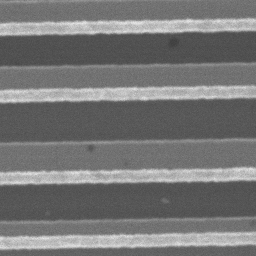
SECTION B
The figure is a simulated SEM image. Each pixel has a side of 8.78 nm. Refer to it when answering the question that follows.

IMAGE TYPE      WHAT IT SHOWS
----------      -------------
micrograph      lines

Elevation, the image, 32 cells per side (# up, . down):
################################
################################
################################
################################
................................
................................
................................
................................
################################
################################
################################
################################
###################.............
................................
................................
................................
................................
.......................#########
################################
################################
################################
################################
################################
................................
................................
................................
................................
...............#################
################################
################################
###############################.
................................